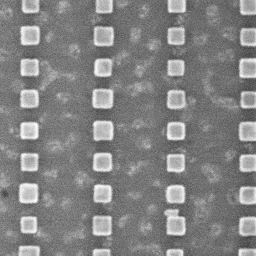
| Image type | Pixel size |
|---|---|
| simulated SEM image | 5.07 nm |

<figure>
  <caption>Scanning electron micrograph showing a regular array of raised bodies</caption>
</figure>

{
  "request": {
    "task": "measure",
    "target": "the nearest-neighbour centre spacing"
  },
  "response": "159 nm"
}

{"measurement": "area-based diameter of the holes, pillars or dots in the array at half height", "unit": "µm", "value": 0.0911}